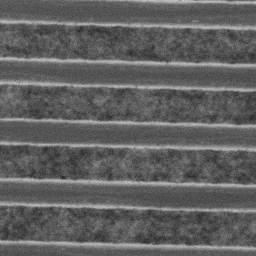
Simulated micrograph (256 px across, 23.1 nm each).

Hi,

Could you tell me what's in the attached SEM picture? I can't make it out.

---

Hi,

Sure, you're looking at lines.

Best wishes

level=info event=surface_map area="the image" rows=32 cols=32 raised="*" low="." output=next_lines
********************************
********************************
********************************
.........................*******
................................
................................
................................
*******.........................
********************************
********************************
...*****************************
................................
................................
................................
................................
*************************.......
********************************
********************************
......................**********
................................
................................
................................
****............................
********************************
********************************
********************************
................................
................................
................................
................................
************....................
********************************